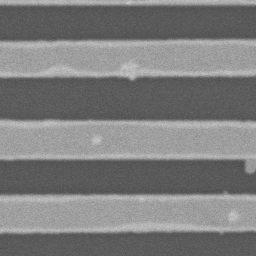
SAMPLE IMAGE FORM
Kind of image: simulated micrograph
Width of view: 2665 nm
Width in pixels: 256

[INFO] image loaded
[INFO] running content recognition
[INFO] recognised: lines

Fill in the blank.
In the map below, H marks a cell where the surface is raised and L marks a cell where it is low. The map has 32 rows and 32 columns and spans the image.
LLLLLLLLLLLLLLLLHLLLLLLLLLLLLLLL
LLLLLLLLLLLLLLLLLLLLLLLLLLLLLLLL
LLLLLLLLLLLLLLLLLLLLLLLLLLLLLLLL
LLLLLLLLLLLLLLLLLLLLLLLLLLLLLLLL
LLLLLLLLLLLLLLLLLLLLLLLLLLLLLLLL
HHHHHHHHHHHHHHHHHHHHHHHHHHHHHHHH
HHHHHHHHHHHHHHHHHHHHHHHHHHHHHHHH
HHHHHHHHHHHHHHHHHHHHHHHHHHHHHHHH
HHHHHHHHHHHHHHHHHHHHHHHHHHHHHHHH
LLLHLLLLLLLLLLLHHLLLLLLLLLLLLLLL
LLLLLLLLLLLLLLLLLLLLLLLLLLLLLLLL
LLLLLLLLLLLLLLLLLLLLLLLLLLLLLLLL
LLLLLLLLLLLLLLLLLLLLLLLLLLLLLLLL
LLLLLLLLLLLLLLLLLLLLLLLLLLLLLLLL
LLLLLLLLLLLLLLLLLLLLLLLLLLLLLLLL
HHHHHHHHHHHHHHHHHHHHHHHHHHHHHHHH
HHHHHHHHHHHHHHHHHHHHHHHHHHHHHHHH
HHHHHHHHHHHHHHHHHHHHHHHHHHHHHHHH
HHHHHHHHHHHHHHHHHHHHHHHHHHHHHHHH
HHHHHHHHHHHHHHHHHHHHHHHHHHHHHHHH
LLLLLLLLLLLLLLLLLLLLLLLLLLLLLLLL
LLLLLLLLLLLLLLLLLLLLLLLLLLLLLLLL
LLLLLLLLLLLLLLLLLLLLLLLLLLLLLLLL
LLLLLLLLLLLLLLLLLLLLLLLLLLLLLLLL
LLLLLLLLLLLLLLHLLLLLLLLLLLHHHLHL
HHHHHHHHHHHHHHHHHHHHHHHHHHHHHHHH
HHHHHHHHHHHHHHHHHHHHHHHHHHHHHHHH
HHHHHHHHHHHHHHHHHHHHHHHHHHHHHHHH
HHHHHHHHHHHHHHHHHHHHHHHHHHHHHHHH
LLLLLLLLLLLLLLLLLLLLLLLLLLLLLLLL
LLLLLLLLLLLLLLLLLLLLLLLLLLLLLLLL
LLLLLLLLLLLLLLLLLLLLLLLLLLLLLLLL